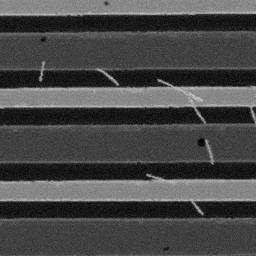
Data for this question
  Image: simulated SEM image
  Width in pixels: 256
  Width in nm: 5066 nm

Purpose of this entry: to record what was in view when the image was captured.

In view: lines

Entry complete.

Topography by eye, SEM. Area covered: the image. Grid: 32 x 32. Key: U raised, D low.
UUUUUUUUUUUUUUUUUUUUUUUUUUUUUUUU
UUUUUUUUUUUUUUUUUUUUUUUUUUUUUUUU
DDDDDDDDDDDDDDDDDDDDDDDDDDDDDDDD
DDDDDDDDDDDDDDDDDDDDDDDDDDDDDDDD
UUUUUUUUUUUUUUUUUUUUUUUUUUUUUUUU
UUUUUUUUUUUUUUUUUUUUUUUUUUUUUUUU
UUUUUUUUUUUUUUUUUUUUUUUUUUUUUUUU
UUUUUUUUUUUUUUUUUUUUUUUUUUUUUUUU
UUUUUUUUUUUUUUUUUUUUUUUUUUUUUUUU
DDDDDDDDDDDDDDDDDDDDDDDDDDDDDDDD
DDDDDDDDDDDDDDDDDDDDDDDDDDDDDDDD
UUUUUUUUUUUUUUUUUUUUUUUUUUUUUUUU
UUUUUUUUUUUUUUUUUUUUUUUUUUUUUUUU
DDDDDDDDDDDDDDDDDDDDDDDDDDDDDDDD
DDDDDDDDDDDDDDDDDDDDDDDDDDDDDDDD
DDDDDDDDDDDDDDDDDDDDDDDDDDDDDDDD
UUUUUUUUUUUUUUUUUUUUUUUUUUUUUUUU
UUUUUUUUUUUUUUUUUUUUUUUUUUUUUUUU
UUUUUUUUUUUUUUUUUUUUUUUUUUUUUUUU
UUUUUUUUUUUUUUUUUUUUUUUUUUUUUUUU
DDDDDDDDDDDDDDDDDDDDDDDDDDDDDDDD
DDDDDDDDDDDDDDDDDDDDDDDDDDDDDDDD
DDDDDDDDDDDDDDDDDDDDUDDDDDDDDDDD
UUUUUUUUUUUUUUUUUUUUUUUUUUUUUUUU
UUUUUUUUUUUUUUUUUUUUUUUUUUUUUUUU
DDDDDDDDDDDDDDDDDDDDDDDDDDDDDDDD
DDDDDDDDDDDDDDDDDDDDDDDDDDDDDDDD
DDDDDDDDDDDDDDDDDUDDUUUUUUUUUUUU
UUUUUUUUUUUUUUUUUUUUUUUUUUUUUUUU
UUUUUUUUUUUUUUUUUUUUUUUUUUUUUUUU
UUUUUUUUUUUUUUUUUUUUUUUUUUUUUUUU
UUUUUUUUUUUUUUUUUUUUUUUUUUUUUUUU